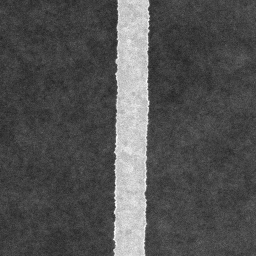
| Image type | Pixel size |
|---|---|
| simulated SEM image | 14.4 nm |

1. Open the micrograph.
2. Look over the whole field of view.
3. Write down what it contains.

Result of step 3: one or a few lines or trenches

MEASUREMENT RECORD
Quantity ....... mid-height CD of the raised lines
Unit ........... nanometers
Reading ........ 438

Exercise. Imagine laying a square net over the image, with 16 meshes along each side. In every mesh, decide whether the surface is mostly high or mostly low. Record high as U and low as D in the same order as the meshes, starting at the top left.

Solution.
DDDDDDDUUDDDDDDD
DDDDDDDUUDDDDDDD
DDDDDDDUUDDDDDDD
DDDDDDDUUDDDDDDD
DDDDDDDUUDDDDDDD
DDDDDDDUUDDDDDDD
DDDDDDDUUDDDDDDD
DDDDDDDUUDDDDDDD
DDDDDDDUUDDDDDDD
DDDDDDDUUDDDDDDD
DDDDDDDUUDDDDDDD
DDDDDDDUUDDDDDDD
DDDDDDDUUDDDDDDD
DDDDDDDUUDDDDDDD
DDDDDDDUUDDDDDDD
DDDDDDDUUDDDDDDD